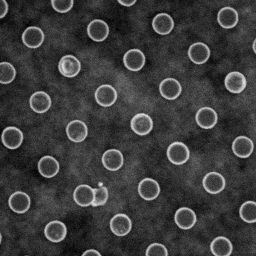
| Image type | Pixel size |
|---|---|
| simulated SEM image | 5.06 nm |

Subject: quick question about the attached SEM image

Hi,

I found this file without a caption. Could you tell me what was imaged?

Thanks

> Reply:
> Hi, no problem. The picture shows a regular array of raised bodies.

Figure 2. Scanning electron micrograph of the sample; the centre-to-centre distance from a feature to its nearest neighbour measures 45.6 px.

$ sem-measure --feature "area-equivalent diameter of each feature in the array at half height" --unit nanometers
108